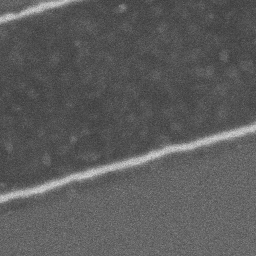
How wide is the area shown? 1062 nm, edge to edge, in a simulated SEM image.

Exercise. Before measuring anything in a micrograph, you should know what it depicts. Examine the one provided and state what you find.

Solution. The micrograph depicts one or a few lines or trenches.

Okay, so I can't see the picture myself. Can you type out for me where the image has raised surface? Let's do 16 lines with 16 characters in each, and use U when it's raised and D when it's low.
DDUUUUUUUUUUUUUU
UUUUUUUUUUUUUUUU
UUUUUUUUUUUUUUUU
UUUUUUUUUUUUUUUU
UUUUUUUUUUUUUUUU
UUUUUUUUUUUUUUUU
UUUUUUUUUUUUUUUU
UUUUUUUUUUUUUUUU
UUUUUUUUUUUUUUDD
UUUUUUUUUUDDDDDD
UUUUUUUDDDDDDDDD
UUUUDDDDDDDDDDDD
DDDDDDDDDDDDDDDD
DDDDDDDDDDDDDDDD
DDDDDDDDDDDDDDDD
DDDDDDDDDDDDDDDD